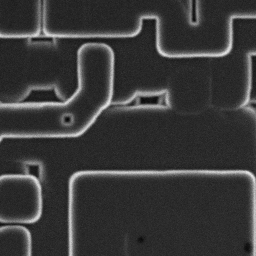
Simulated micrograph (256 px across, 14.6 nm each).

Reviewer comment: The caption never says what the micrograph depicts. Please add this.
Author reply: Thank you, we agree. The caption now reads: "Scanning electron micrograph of wiring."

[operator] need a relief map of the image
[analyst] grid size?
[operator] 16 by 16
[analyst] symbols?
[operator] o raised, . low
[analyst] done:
oooooooooooooooo
ooooooooo.ooooo.
.....o....oooo..
.....oo...ooo...
.....oo.........
.....oo.........
...oooo.........
oooooo..........
oooo............
................
................
oo..oooooooooooo
ooo.oooooooooooo
oo..oooooooooooo
oo..oooooooooooo
oo..oooooooooooo